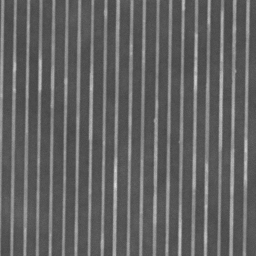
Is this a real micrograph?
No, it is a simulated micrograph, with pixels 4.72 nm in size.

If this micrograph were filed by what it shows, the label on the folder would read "parallel lines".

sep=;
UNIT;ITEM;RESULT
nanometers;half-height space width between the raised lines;49.6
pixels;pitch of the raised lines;12.9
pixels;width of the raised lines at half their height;2.75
